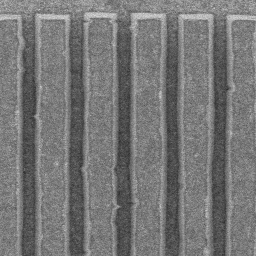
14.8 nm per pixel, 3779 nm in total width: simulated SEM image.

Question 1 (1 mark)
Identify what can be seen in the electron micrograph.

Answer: parallel lines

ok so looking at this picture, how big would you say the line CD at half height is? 0.454 um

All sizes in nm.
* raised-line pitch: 705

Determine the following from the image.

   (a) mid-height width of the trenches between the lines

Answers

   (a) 249 nm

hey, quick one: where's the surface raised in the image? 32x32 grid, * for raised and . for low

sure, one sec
................................
................................
**...****..***...***...***...***
***..****..***...****..***...***
***..***...***...***...***...***
***..****..***...****..***...***
***..****..***...****..***...***
***..****..***...***...***...***
***..****..***...***...****..***
***..****..***...***...****..***
***..****..***...***...****..***
***..****..***...***...****..***
***..****..***...***...****..***
***..****..***...***...****..***
***.*****..***...****..****..***
***..****..***..*****..****..***
***..****..***...****..****.****
***..****..***...****..***..****
***..****..***...****..***..****
**...****..***...****..***..****
***..***..****...****..***..****
***..***..****...****..***..****
***..***...***...****..***..****
***..***...***...****..***..****
***..***...***...***...***..****
***..***...****..***...***...***
***..***...***...***...***..****
***..***...***...***...***..****
**...***...***...***...***..****
**...***...***...***...***..****
**...***...***...***...***..****
**...***...***...***...***..****